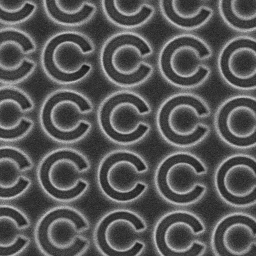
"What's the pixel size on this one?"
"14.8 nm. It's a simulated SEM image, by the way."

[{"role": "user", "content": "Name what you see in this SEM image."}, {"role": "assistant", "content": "an array of small figures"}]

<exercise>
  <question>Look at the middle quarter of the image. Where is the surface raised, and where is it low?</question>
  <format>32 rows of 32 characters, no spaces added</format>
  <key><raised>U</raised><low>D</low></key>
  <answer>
UUUUDDUUUUDDDUUUUUUDDUUUDDDUUUUU
UUUDDDUUUUDDDUUUUUDDDDUUDDDUUUUU
DDDDDDUUUUUDDDDDDDDDDUUUUDDDUUUU
DDDDUUUUUUUUDDDDDDDDUUUUUUDDDDDD
DDUUUUUUUUUUUDDDDDDUUUUUUUUDDDDD
UUUUUUUUUUUUUUUUUUUUUUUUUUUUUUDD
UUUUUUUUUUUUUUUUUUUUUUUUUUUUUUUU
DDDUUUUUUUUUUDDDDUUUUUUUUUUUUUUU
DDDDDUUUUUUDDDDDDDDUUUUUUUUDDDDD
UUDDDDUUUUDDDDDDDDDDUUUUUUDDDDDD
UUUDDDDUUUDDDUUUUUDDDUUUUDDDDUUD
UUUUDDUUUDDDUUUUUUUDDUUUDDDUUUUU
UUUUUUUUUDDDUUUUUUUUUUUUDDDUUUUU
UUUUUUUUUDDDUUUUUUUUUUUUDDUUUUUU
UUUUDUUUUDDDUUUUUUUUUUUUDDUUUUUU
UUUDDDUUUDDDUUUUUUDDDUUUDDDUUUUU
UUDDDDUUUUDDDUUUUUDDDUUUDDDUUUUU
DDDDDUUUUUUDDDDDDDDDUUUUUDDDDUUD
DDDDUUUUUUUUDDDDDDDUUUUUUDDDDDDD
UUUUUUUUUUUUUUDDDUUUUUUUUUUDDDDD
UUUUUUUUUUUUUUUUUUUUUUUUUUUUUUUU
DUUUUUUUUUUUUUUUUUUUUUUUUUUUUUUU
DDDUUUUUUUUUDDDDDUUUUUUUUUUUDDDU
DDDDDUUUUUDDDDDDDDDUUUUUUUDDDDDD
UUDDDDUUUUDDDDUUDDDDUUUUUDDDDDDD
UUUDDDUUUDDDUUUUUDDDUUUUDDDUUUUU
UUUUUUUUUDDUUUUUUUDDUUUUDDUUUUUU
UUUUUUUUUDDUUUUUUUUUUUUDDDUUUUUU
UUUUUUUUUDDUUUUUUUUUUUUDDDUUUUUU
UUUDDUUUUDDUUUUUUUUUUUUDDDUUUUUU
UUUDDDUUUDDDUUUUUUDDUUUDDDUUUUUU
DDDDDUUUUUDDDUUUUDDDUUUUDDDUUUUU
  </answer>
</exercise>